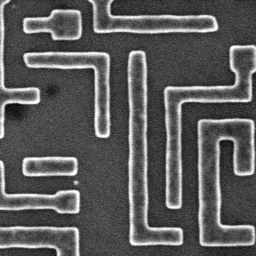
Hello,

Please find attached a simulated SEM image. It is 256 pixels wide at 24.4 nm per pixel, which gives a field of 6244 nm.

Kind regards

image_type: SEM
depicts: wiring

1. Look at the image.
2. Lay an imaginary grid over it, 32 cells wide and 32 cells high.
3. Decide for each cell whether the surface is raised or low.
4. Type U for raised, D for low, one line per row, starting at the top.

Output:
UDDDDDDDDDDUUUDDDDDDDDDDDDDDDDDD
DDDDDDDUUUDDUUDDDDDDDDDDDDDDDDDD
DDDUUUUUUUDDUUUUUUUUUUUUUUUDDDDD
DDDUUUUUUUDDUUUUUUUUUUUUUUUDDDDD
DDDDDDDUUUDDDDDDDDDDDDDDDDDDDDDD
DDDDDDDDDDDDDDDDDDDDDDDDDDDDDDDD
DDDDDDDDDDDDDDDDDUDDDDDDDDDDDUUU
DDDUUUUUUUUUUUDDUUDDDDDDDDDDDUUU
DDDDDDDUUUDUUUDDUUDDDDDDDDDDDUUU
DDDDDDDDDDDDUUDDUUDDDDDDDDDDDDUD
DDDDDDDDDDDDUUDDUUDDDDDDDDDDDUUD
UUUUUDDDDDDDUUDDUUDDDUUUUUUUUUUD
UUUUUDDDDDDDUUDDUUDDDUUUUUUUUUUD
UDDDDDDDDDDDUUDDUUDDDUUDDDDDDDDD
DDDDDDDDDDDDUUDDUUDDDUUDDDDDDDDD
DDDDDDDDDDDDUUDDUUDDDUUDDUUUUUUU
DDDDDDDDDDDDUUDDUUDDDUUDDUUUUUUU
DDDDDDDDDDDDDDDDUUDDDUDDDUUUDUUU
DDDDDDDDDDDDDDDDUUDDDUUDDUUDDUUU
DDDDDDDDDDDDDDDDUUDDDUUDDUUDDUUU
DDDUUUUUUUDDDDDDUUDDDUUDDUUDDUUU
DDDUUUUUUDDDDDDDUUDDDUUDDUUDDUUD
DDDDDDDDDDDDDDDDUUDDDUUDDUUDDDDD
DDDDDDDDDDDDDDDDUUDDDUUDDUUDDDDD
UUUUUUUUUUDDDDDDUUDDDUUDDUUDDDDD
UUUUUUUUUUDDDDDDUUDDDUUDDUUDDDDD
DDDDDDDUUDDDDDDDUUDDDDDDDUUDDDDD
DDDDDDDDDDDDDDDDUUDDDDDDDUUDDDDD
UUUUUUUUUDDDDDDDUUUDDDDDDUUUUUUU
UUUUUUUUUUDDDDDDUUUUUUUDDUUUUUUU
UUUUUUUUUUDDDDDDDUUUUUDDDUUUUUUD
DDDDDDDUUUDDDDDDDDDDDDDDDDDDDDDD